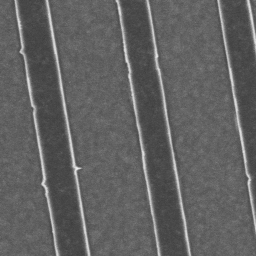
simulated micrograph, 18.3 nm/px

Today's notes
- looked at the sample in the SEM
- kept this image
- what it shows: one or a few lines or trenches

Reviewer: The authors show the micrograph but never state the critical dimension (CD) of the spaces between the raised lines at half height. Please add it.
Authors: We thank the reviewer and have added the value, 1.26 um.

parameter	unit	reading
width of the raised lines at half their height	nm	560